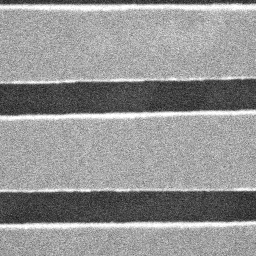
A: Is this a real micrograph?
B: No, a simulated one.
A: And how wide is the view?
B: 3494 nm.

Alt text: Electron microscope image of lines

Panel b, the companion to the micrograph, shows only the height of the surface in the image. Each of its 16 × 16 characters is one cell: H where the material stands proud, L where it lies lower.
HHHHHHHHHHHHHHHH
HHHHHHHHHHHHHHHH
HHHHHHHHHHHHHHHH
HHHHHHHHHHHHHHHH
HHHHHHHHHHHHHHHH
LLLLLLLLLLLLLLLL
LLLLLLLLLLLLLLLL
HHHHHHHHHHHHHHHH
HHHHHHHHHHHHHHHH
HHHHHHHHHHHHHHHH
HHHHHHHHHHHHHHHH
HHHHHHHHHHHHHHHH
LLLLLLLLLLLLLLLL
LLLLLLLLLLLLLLLL
HHHHHHHHHHHHHHHH
HHHHHHHHHHHHHHHH